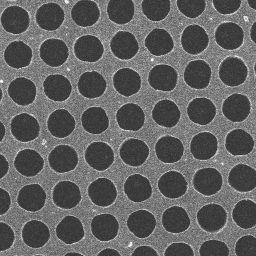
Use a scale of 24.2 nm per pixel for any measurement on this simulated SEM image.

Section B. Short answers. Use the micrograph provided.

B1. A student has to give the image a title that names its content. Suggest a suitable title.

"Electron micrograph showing a regular array of holes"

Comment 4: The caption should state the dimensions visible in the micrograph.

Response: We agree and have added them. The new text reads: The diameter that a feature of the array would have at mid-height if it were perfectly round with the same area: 682 nanometers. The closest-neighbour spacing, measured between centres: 845 nanometres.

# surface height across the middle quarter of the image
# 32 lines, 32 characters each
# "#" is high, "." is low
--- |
#######################....####.
##############...#####......##..
#####....####......##.......##..
.###......##.......##.......##..
.###......##.......##.......##..
..#........##......###......###.
..##......###......#####...#####
..##......####....##############
.#####..########################
########################...#####
###############....####.....###.
.####.....####......##.......##.
..###.....###.......##.......##.
..##.......##.......##.......##.
...#.......##.......###.....####
...##......###......####....####
..###.....######...#############
.######..#######################
########################....####
########.######.....###......###
.#####.....###.......##.......#.
...###......##.......##.......##
...##........#.......##.......##
....#.......##.......##......###
....##......###.....#####...####
...####....######.##############
..######..######################
#########################....###
#########.######.....###......##
..#####.....###......###.......#
...###.......##.......#........#
....##.......##.......##.......#